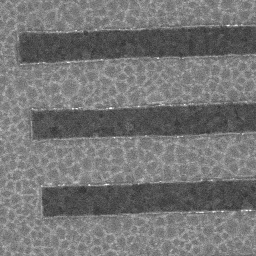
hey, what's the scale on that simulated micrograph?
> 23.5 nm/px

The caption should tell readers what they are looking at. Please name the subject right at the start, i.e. one or a few lines or trenches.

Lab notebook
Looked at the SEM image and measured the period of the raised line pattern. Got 76.6 pixels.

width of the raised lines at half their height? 721 nm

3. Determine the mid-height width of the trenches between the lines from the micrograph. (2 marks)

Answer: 46.1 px